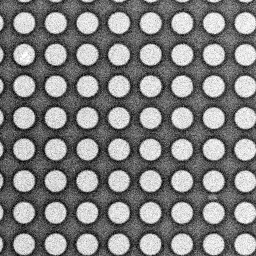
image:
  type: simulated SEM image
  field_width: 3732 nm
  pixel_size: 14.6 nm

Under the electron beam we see an array of small figures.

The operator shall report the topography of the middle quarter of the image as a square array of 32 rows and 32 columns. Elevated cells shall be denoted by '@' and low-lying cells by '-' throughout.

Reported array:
--------------------------------
--------------------------------
--------------------------------
----@@@-----@@@-----@@@-----@@@-
----@@@@---@@@@@---@@@@@---@@@@@
---@@@@@---@@@@@---@@@@@---@@@@@
---@@@@@---@@@@@---@@@@@---@@@@@
----@@@@----@@@@----@@@-----@@@-
--------------------------------
--------------------------------
--------------------------------
----@@@@----@@@-----@@@-----@@@-
---@@@@@---@@@@@---@@@@@---@@@@@
---@@@@@---@@@@@---@@@@@---@@@@@
---@@@@@---@@@@@---@@@@@---@@@@@
----@@@@----@@@-----@@@-----@@@-
--------------------------------
--------------------------------
--------------------------------
----@@@@----@@@@----@@@-----@@@-
---@@@@@---@@@@@---@@@@@---@@@@@
---@@@@@---@@@@@---@@@@@---@@@@@
---@@@@@---@@@@@---@@@@@---@@@@@
----@@@-----@@@-----@@@-----@@@-
--------------------------------
--------------------------------
--------------------------------
----@@@@----@@@@----@@@@----@@@-
---@@@@@---@@@@@---@@@@@---@@@@@
---@@@@@---@@@@@---@@@@@---@@@@@
---@@@@@---@@@@@---@@@@@---@@@@@
-----@@-----@@@-----@@@-----@@@-